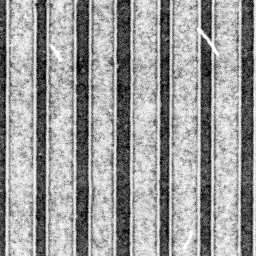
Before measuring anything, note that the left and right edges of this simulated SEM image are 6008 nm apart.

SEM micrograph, parallel lines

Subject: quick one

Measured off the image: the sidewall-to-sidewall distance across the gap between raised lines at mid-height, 27.5 pixels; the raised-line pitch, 967 nm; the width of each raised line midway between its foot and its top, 332 nanometres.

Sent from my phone